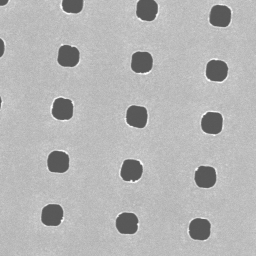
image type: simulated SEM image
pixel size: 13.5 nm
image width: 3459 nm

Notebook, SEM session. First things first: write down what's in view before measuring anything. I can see a regular array of holes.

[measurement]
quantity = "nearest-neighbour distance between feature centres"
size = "719 nanometers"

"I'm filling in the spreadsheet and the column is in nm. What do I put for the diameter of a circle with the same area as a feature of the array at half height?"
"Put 309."